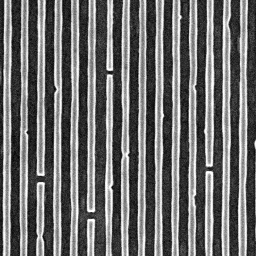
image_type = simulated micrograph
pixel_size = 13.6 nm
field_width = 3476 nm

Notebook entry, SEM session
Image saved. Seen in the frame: parallel lines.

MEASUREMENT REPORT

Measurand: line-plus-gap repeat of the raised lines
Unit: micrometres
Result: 0.229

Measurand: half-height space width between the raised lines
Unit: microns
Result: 0.146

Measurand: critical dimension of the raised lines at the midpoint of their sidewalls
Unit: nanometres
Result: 86.6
